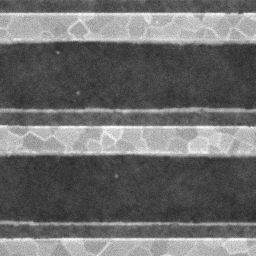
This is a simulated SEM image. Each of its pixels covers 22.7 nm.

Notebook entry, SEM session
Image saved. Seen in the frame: lines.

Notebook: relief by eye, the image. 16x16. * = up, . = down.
****************
****************
................
................
................
................
................
****************
****************
****************
................
................
................
................
****************
****************